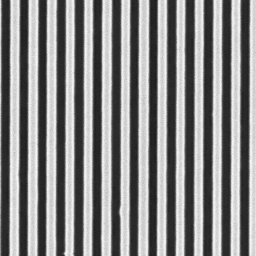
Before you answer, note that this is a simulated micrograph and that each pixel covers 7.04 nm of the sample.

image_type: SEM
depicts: parallel lines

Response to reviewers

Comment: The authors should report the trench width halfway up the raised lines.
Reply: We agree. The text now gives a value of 0.0572 um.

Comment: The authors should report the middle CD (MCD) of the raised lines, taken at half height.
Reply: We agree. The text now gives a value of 0.0704 um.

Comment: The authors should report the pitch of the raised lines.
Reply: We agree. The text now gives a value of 18.4 pixels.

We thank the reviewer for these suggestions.